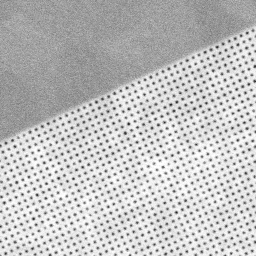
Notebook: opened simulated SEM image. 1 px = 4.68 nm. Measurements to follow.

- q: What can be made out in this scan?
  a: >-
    a regular array of holes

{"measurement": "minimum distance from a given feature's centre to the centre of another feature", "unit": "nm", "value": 29.9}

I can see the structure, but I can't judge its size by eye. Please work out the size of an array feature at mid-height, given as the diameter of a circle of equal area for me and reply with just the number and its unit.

15.9 nm